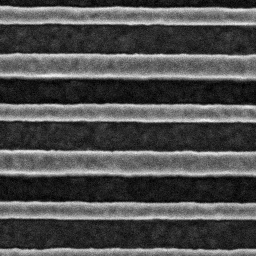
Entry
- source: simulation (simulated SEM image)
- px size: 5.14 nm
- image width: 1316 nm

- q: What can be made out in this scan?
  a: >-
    lines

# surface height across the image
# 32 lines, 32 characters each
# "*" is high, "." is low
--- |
................................
********************************
********************************
................................
................................
................................
................................
********************************
********************************
.*******************************
................................
................................
................................
********************************
********************************
................................
................................
................................
................................
********************************
********************************
********************************
................................
................................
................................
********************************
********************************
................................
................................
................................
................................
********************************